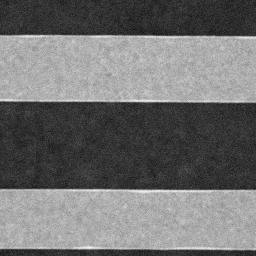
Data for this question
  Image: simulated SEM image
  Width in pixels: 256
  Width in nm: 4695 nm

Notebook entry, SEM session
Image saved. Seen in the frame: groups of lines, slits or small figures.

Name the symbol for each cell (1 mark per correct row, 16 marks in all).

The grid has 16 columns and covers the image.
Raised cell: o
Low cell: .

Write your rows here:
................
................
oooooooooooooooo
oooooooooooooooo
oooooooooooooooo
oooooooooooooooo
................
................
................
................
................
................
oooooooooooooooo
oooooooooooooooo
oooooooooooooooo
oooooooooooooooo